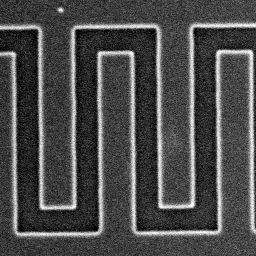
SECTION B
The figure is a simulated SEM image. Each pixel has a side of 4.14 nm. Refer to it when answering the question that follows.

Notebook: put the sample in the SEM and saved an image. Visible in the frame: groups of lines, slits or small figures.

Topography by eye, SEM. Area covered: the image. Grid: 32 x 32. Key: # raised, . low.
################################
################################
################################
###########........#####........
.....####...........####........
.....####...........####........
.....####...........####...####.
##...####...#####...####...#####
##...####...#####...####...#####
##...####...#####...####...#####
##...####...#####...####...#####
##...####...#####...####...#####
##...####...#####...####...#####
##...####...#####...####...#####
##...####...#####...####...#####
##...####...#####...####...#####
##...####...#####...####...#####
##...####...#####...####...#####
##...####...#####...####...#####
##...####...#####...####...#####
##...####...#####...####...#####
##...####...#####...####...#####
##...####....####...####...#####
##...####...#####...####...#####
##...####...#####...####...#####
##...####....####...####...#####
##...........####..........#####
##...........####..........#####
##..........#####..........#####
################################
################################
################################